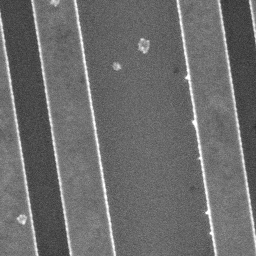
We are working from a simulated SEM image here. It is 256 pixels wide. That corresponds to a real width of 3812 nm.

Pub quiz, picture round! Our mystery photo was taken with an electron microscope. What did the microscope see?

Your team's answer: lines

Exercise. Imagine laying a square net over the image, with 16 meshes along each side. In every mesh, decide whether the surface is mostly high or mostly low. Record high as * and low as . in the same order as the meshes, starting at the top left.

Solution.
..***......***..
..***......***..
..***......***..
...**.......**..
*..**.......**..
*..***......***.
*..***......***.
*..***......***.
*..***......***.
*..***......***.
**..**.......**.
**..***......**.
**..***......***
**..***......***
**..***......***
**..***......***